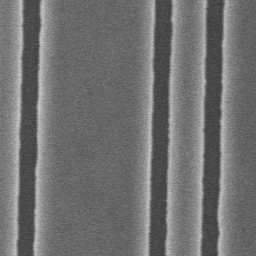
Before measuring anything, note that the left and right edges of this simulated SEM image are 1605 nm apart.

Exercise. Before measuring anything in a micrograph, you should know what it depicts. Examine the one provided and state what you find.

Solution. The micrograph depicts lines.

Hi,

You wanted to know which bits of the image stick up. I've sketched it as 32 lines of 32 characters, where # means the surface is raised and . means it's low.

###..##############...####..####
###..##############...####..####
###..##############..#####..####
###..##############...####..####
###..##############...####..####
###..##############..#####..####
###..##############..#####..####
###..##############..#####..####
###..##############..#####..####
###..##############..#####..####
###..##############..#####..####
###..##############..#####..####
###..##############..#####..####
###..##############..####...####
###..##############..####...####
##...##############..####...####
##...##############..####...####
##...##############..####...####
##...##############..####...####
##...##############..####...####
##...##############..####...####
##..###############..####...####
##...##############..####...####
##..###############..####...####
##..###############..####..#####
##..###############..####..#####
##..###############..####..#####
##..###############..####..#####
##..###############..####..#####
##..###############..####..#####
##..###############..####..#####
##..###############..####..#####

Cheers